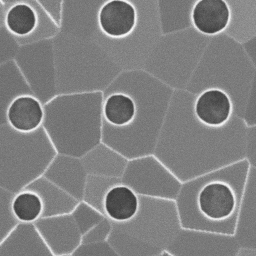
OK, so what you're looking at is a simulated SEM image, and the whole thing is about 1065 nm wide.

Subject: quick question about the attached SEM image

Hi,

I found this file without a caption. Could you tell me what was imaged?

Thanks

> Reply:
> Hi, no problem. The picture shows holes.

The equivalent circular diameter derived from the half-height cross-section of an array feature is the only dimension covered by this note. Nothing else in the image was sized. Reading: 138 nanometres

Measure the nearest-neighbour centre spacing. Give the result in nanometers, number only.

389